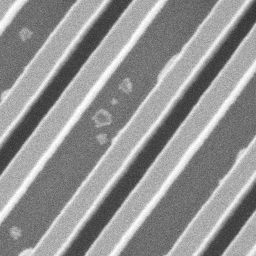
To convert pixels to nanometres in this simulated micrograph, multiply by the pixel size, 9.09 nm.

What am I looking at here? lines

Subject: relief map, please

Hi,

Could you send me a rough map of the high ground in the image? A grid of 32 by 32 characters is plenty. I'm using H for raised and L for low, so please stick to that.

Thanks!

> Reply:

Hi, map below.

HHHLLLLLLHHHHLLLHHHHLLLLLLLHHHHL
HHLLLLLLLHHHHLLLHHHLLLLLLLHHHHLL
HLLLLLLLHHHHLLLHHHHLLLLLLLHHHHLL
LLLLLLLHHHHLLLHHHHLLLLLLLHHHHLLL
LLLLLLHHHHLLLHHHHLLLLLLLHHHHLLLH
LLLLLLHHHHLLLHHHHLLLLLLHHHHLLLHH
LLLLLHHHHLLLHHHHLLLLLLLHHHHLLHHH
LLLLHHHHLLLHHHHLLLLLLLHHHHLLLHHH
LLLHHHHLLLHHHHLLLLLLLHHHHLLLHHHH
LLLHHHHLLHHHHLLLLLLLHHHHLLLHHHHL
LLHHHHLLLHHHHLLLLLLLHHHHLLHHHHLL
LHHHHLLLHHHHLLLLLLLHHHHLLLHHHHLL
HHHHLLLHHHHLLLLLLLHHHHLLLHHHHLLL
HHHHLLHHHHLLLLLLLHHHHLLLHHHHLLLL
HHHLLLHHHHLLLLLLLHHHHLLLHHHLLLLL
HHLLLHHHHLLLLLLLHHHHLLLHHHHLLLLL
HLLLHHHHLLLLLLLHHHHLLLHHHHLLLLLL
HLLHHHHHLLLLLLHHHHLLLHHHHLLLLLLL
LLLHHHHLLLLLLLHHHHLLLHHHLLLLLLLH
LLHHHHLLLLLLLHHHHLLLHHHHLLLLLLHH
LHHHHLLLLLLLHHHHLLLHHHHLLLLLLHHH
HHHHHLLLLLLHHHHLLLHHHHLLLLLLLHHH
HHHHLLLLLLLHHHHLLLHHHLLLLLLLHHHH
HHHLLLLLLLHHHHLLLHHHHLLLLLLHHHHL
HHLLLLLLLHHHHLLLHHHHLLLLLLHHHHLL
HHLLLLLLHHHHLLLHHHHLLLLLLLHHHHLL
HLLLLLLLHHHHLLLHHHLLLLLLLHHHHLLL
LLLLLLLHHHHLLLHHHHLLLLLLHHHHLLLH
LLLLLLHHHHLLLHHHHLLLLLLHHHHLLLHH
LLLLLHHHHLLLHHHHLLLLLLLHHHHLLLHH
LLLLLHHHHLLLHHHLLLLLLLHHHHLLLHHH
LLLLHHHHLLLHHHHLLLLLLHHHHLLLHHHH